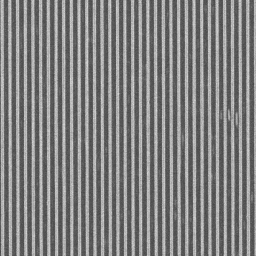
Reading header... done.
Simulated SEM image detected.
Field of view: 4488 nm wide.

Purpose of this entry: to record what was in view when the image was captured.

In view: parallel lines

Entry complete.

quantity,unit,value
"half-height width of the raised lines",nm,32.9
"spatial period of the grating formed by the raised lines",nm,135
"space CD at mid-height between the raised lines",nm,98.6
